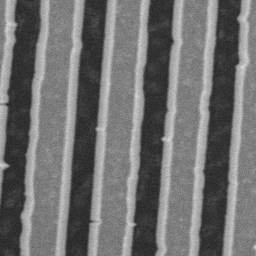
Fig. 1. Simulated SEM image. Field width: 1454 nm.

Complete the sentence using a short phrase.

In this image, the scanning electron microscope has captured one or a few lines or trenches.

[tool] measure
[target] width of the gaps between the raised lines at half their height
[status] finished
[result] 0.182 um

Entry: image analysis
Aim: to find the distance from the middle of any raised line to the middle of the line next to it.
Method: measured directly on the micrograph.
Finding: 380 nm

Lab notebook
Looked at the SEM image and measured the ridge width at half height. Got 199 nanometers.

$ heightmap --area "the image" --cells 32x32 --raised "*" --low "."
*.....****....****....*****....*
*.....****....****....*****....*
*.....****....****....*****...**
*.....****....****....*****....*
*....*****....****....****....**
*....*****....****....****....**
*....****....*****....****....**
*....****....*****....****....**
*....****....****.....****....**
*....****....****.....****....**
*....****....****.....****....**
....*****....****.....****....**
....*****....****.....****....**
....*****....****....*****....**
....*****....****....*****....**
....*****....****....****.....**
....*****....****....****....***
....*****....****....****.....**
....*****....****....****....***
....*****...*****....****....***
....****....*****....****....***
....****....*****....****....***
....****....*****....****....***
....****....****.....****....***
....****....****.....****....***
....****....****....*****....***
...*****....****....*****....***
...*****....****....*****....***
...*****....****....****.....***
...*****....****....****.....***
...*****....****....****.....***
...*****....****....****....****